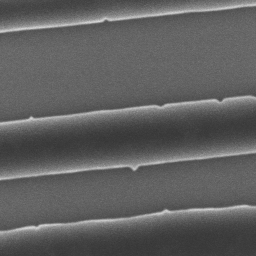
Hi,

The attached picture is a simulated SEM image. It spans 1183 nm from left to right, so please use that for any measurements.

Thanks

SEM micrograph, one or a few lines or trenches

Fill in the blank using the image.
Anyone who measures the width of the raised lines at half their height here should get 262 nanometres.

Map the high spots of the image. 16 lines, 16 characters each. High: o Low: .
ooooooooooooooo.
ooooo...........
................
................
................
................
...........ooooo
.ooooooooooooooo
oooooooooooooooo
oooooooooooooooo
ooooooo.........
................
................
.........ooooooo
oooooooooooooooo
oooooooooooooooo